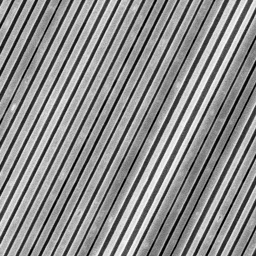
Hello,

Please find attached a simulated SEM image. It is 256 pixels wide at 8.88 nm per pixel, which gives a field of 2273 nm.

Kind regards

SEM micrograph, parallel lines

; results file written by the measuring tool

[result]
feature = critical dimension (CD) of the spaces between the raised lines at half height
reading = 33.8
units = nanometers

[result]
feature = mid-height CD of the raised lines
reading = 59.6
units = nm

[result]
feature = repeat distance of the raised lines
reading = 94.3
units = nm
